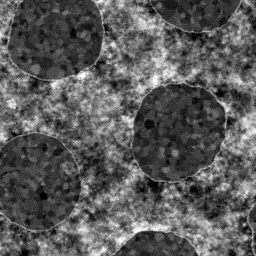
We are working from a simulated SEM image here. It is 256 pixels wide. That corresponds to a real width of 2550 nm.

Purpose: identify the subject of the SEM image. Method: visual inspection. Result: raised bodies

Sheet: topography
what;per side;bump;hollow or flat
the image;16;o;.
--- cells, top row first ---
.ooooo....ooooo.
.ooooo.....ooo..
.ooooo..........
.ooooo..........
..ooo...........
..........ooo...
.........ooooo..
........oooooo..
.oo.....oooooo..
oooo....oooooo..
ooooo....oooo...
ooooo...........
ooooo...........
oooo............
.........oo.....
.......ooooo....